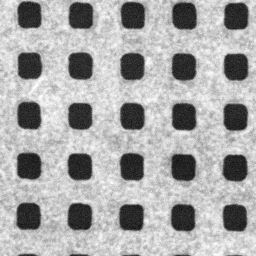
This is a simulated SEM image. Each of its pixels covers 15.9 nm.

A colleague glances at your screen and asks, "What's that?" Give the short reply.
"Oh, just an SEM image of a regular array of holes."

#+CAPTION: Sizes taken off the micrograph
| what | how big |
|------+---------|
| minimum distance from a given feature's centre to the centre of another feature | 50.2 px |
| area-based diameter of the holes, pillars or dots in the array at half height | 451 nanometres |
